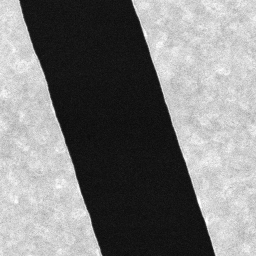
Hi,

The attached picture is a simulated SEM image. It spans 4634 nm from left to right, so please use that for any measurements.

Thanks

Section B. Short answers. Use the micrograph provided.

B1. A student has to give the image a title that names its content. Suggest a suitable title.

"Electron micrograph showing one or a few lines or trenches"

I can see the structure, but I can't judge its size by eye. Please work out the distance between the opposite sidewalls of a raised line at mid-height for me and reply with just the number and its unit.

1980 nm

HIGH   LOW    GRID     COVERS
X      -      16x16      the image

-XXXXXXX--------
--XXXXXXX-------
--XXXXXXX-------
--XXXXXXX-------
---XXXXXXX------
---XXXXXXX------
---XXXXXXX------
----XXXXXXX-----
----XXXXXXX-----
----XXXXXXX-----
-----XXXXXXX----
-----XXXXXXX----
-----XXXXXXX----
------XXXXXXX---
------XXXXXXX---
------XXXXXXX---